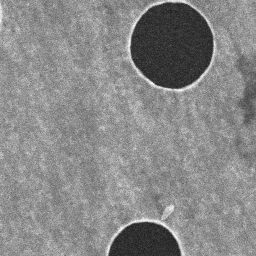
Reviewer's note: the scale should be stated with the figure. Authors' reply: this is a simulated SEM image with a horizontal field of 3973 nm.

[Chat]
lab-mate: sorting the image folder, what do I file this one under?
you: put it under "holes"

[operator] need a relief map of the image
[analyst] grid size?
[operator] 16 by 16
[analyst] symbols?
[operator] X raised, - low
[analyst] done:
XXXXXXXXX---XXXX
XXXXXXXXX----XXX
XXXXXXXX-----XXX
XXXXXXXX-----XXX
XXXXXXXXX----XXX
XXXXXXXXXX-XXXXX
XXXXXXXXXXXXXXXX
XXXXXXXXXXXXXXXX
XXXXXXXXXXXXXXXX
XXXXXXXXXXXXXXXX
XXXXXXXXXXXXXXXX
XXXXXXXXXXXXXXXX
XXXXXXXXXXXXXXXX
XXXXXXXXXXXXXXXX
XXXXXXXX---XXXXX
XXXXXXX----XXXXX